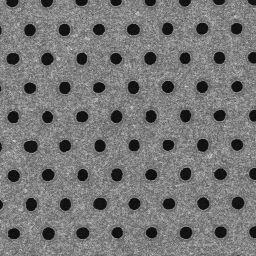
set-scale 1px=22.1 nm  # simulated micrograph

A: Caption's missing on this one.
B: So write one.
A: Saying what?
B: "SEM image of a regular array of holes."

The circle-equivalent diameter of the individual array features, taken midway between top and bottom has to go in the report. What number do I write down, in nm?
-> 266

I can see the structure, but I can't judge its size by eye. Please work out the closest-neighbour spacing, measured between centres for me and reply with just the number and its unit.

33.5 pixels